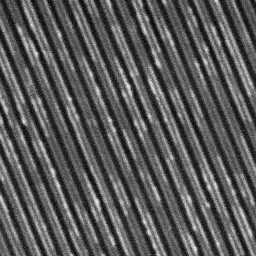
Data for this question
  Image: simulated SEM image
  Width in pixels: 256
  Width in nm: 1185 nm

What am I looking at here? parallel lines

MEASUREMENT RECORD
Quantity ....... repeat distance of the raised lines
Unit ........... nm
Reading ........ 67.1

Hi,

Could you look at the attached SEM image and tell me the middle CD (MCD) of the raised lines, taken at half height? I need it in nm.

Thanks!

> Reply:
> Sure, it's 35.3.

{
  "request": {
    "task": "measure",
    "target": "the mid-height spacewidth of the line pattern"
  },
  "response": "30.5 nm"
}